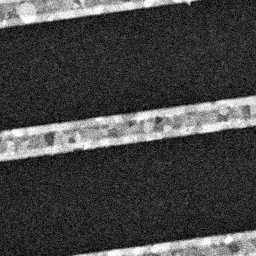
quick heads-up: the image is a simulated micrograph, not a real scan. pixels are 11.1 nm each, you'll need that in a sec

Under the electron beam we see one or a few lines or trenches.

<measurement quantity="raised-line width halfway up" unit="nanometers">246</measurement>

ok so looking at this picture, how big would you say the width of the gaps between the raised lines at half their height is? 1220 nm